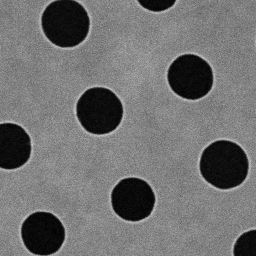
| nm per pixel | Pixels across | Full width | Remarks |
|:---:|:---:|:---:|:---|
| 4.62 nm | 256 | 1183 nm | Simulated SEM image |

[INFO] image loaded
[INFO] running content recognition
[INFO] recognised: holes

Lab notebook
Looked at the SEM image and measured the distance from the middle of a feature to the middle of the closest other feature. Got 436 nanometers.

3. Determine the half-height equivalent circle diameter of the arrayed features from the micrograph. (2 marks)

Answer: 216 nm